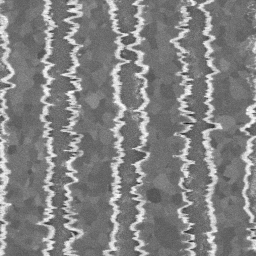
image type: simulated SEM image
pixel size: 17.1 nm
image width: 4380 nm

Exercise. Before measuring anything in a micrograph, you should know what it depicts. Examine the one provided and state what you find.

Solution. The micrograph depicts one or a few lines or trenches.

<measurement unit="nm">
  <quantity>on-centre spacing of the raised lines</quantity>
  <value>1170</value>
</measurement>